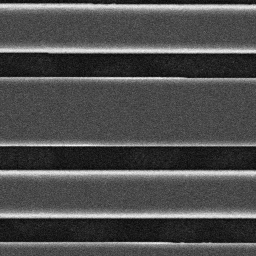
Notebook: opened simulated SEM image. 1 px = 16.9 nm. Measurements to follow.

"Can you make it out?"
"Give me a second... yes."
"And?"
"lines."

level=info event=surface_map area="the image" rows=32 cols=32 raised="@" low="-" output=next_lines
--------------------------------
@@@@@@@@@@@@@@@@@@@@@@@@@@@@@@@@
@@@@@@@@@@@@@@@@@@@@@@@@@@@@@@@@
@@@@@@@@@@@@@@@@@@@@@@@@@@@@@@@@
@@@@@@@@@@@@@@@@@@@@@@@@@@@@@@@@
@@@@@@@@@@@@@@@@@@@@@@@@@@@@@@@@
-----------------------@-@@@@@@@
--------------------------------
--------------------------------
--------------------------------
@@@@@@@@@@@@@@@@@@@@@@@@@@@@@@@@
@@@@@@@@@@@@@@@@@@@@@@@@@@@@@@@@
@@@@@@@@@@@@@@@@@@@@@@@@@@@@@@@@
@@@@@@@@@@@@@@@@@@@@@@@@@@@@@@@@
@@@@@@@@@@@@@@@@@@@@@@@@@@@@@@@@
@@@@@@@@@@@@@@@@@@@@@@@@@@@@@@@@
@@@@@@@@@@@@@@@@@@@@@@@@@@@@@@@@
@@@@@@@@@@@@@@@@@@@@@@@@@@@@@@@@
--------------------------------
--------------------------------
--------------------------------
@@@@@@@@@@@@@@@@@@@@@@@@@@@@@@@@
@@@@@@@@@@@@@@@@@@@@@@@@@@@@@@@@
@@@@@@@@@@@@@@@@@@@@@@@@@@@@@@@@
@@@@@@@@@@@@@@@@@@@@@@@@@@@@@@@@
@@@@@@@@@@@@@@@@@@@@@@@@@@@@@@@@
@@@@@@@@@@@@@@@@@@@@@@@@@@@@@@@@
--------------------------------
--------------------------------
--------------------------------
@@@@@@@@@@@@@@@@@@@@@@@@@@@@@@@@
@@@@@@@@@@@@@@@@@@@@@@@@@@@@@@@@